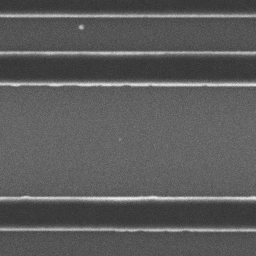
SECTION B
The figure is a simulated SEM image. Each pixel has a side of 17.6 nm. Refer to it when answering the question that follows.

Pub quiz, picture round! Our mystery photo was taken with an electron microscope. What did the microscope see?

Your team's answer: lines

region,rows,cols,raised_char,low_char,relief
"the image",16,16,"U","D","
UUUUUUUUUUUUUUUU
DDDDDDDDDDDDDDDD
DDDDDDDDDDDDDDDD
UUUUUUUUUUUUUUUU
UUUUUUUUUUUUUUUU
DDDDDDDDDDDDDDDD
DDDDDDDDDDDDDDDD
DDDDDDDDDDDDDDDD
DDDDDDDDDDDDDDDD
DDDDDDDDDDDDDDDD
DDDDDDDDDDDDDDDD
DDDDDDDDDDDDDDDD
UUUUUUUUUUUUUUUU
UUUUUUUUUUUUUUUU
DDDDDDDDDDDDDDDD
DDDDDDDDDDDDDDDD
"